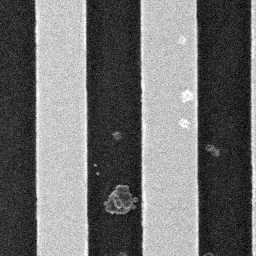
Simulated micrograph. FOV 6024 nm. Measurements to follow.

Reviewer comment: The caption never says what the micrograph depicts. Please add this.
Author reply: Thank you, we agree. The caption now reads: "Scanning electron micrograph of lines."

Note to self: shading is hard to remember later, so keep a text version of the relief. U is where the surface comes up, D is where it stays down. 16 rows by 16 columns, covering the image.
DDUUUDDDDUUUDDDD
DDUUUDDDDUUUDDDD
DDUUUDDDDUUUDDDD
DDUUUDDDDUUUDDDD
DDUUUDDDDUUUDDDD
DDUUUDDDDUUUDDDD
DDUUUDDDDUUUDDDD
DDUUUDDDDUUUDDDD
DDUUUDDDDUUUDDDD
DDUUUDDDDUUUDDDD
DDUUUDDDDUUUDDDD
DDUUUDDDDUUUDDDD
DDUUUDDDDUUUDDDD
DDUUUDDDDUUUDDDD
DDUUUDDDDUUUDDDD
DDUUUDDDDUUUDDDD